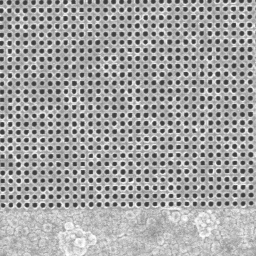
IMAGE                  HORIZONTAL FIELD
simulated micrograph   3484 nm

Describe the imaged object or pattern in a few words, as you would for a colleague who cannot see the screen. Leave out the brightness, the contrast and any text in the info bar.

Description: a regular array of holes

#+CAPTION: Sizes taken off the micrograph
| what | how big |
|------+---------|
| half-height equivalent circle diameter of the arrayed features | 66.9 nanometers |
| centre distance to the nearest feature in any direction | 7.83 px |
